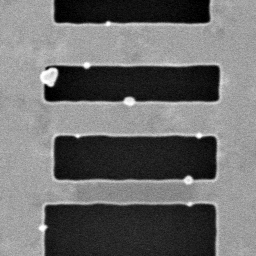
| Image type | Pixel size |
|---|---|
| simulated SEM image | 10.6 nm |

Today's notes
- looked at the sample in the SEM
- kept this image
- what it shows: groups of lines, slits or small figures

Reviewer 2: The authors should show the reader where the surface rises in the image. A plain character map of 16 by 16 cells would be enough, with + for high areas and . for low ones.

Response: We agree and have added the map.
+++..........+++
++++++++++++++++
++++++++++++++++
++++++++++++++++
++++..........++
+++...........++
++++++++++++++++
++++++++++++++++
+++++.......++++
+++...........++
+++...........++
++++++++++++++++
++++++++++++++++
+++..........+++
+++...........++
+++..........+++